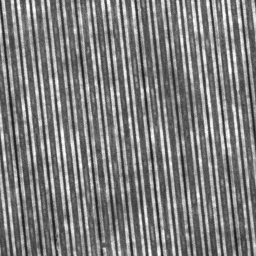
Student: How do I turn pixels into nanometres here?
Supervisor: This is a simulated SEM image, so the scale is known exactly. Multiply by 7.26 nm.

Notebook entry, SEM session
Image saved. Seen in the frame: parallel lines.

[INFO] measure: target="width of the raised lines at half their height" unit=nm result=18.9